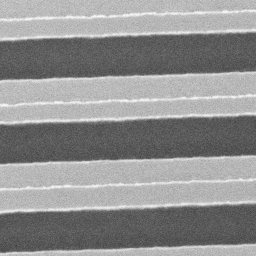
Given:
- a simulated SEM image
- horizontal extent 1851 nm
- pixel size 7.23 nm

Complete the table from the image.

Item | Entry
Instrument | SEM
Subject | lines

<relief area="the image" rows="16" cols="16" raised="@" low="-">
@@@@@@@@@@@@@@@@
@@@@@@@@@@@@@@@@
----------------
----------------
----------------
@@@@@@@@@@@@@@@@
@@@@@@@@@@@@@@@@
@@@@@-----------
----------------
----------------
@@@@@@@@@@@@@@@@
@@@@@@@@@@@@@@@@
@@@@@@@@@@@@@@@@
----------------
----------------
-----------@@@@@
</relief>